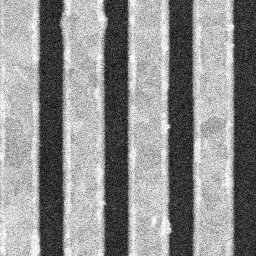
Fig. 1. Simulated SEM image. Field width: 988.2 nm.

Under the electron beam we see one or a few lines or trenches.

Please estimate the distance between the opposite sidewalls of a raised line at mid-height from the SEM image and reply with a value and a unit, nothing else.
0.139 microns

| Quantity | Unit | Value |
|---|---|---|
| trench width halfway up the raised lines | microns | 0.11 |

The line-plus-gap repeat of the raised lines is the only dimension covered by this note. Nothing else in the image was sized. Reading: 250 nanometres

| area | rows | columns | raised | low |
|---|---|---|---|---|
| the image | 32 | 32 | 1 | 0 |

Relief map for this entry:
11111000111110001111100011111000
11111000111110001111100011111000
11111000111110001111100011111000
11111000111110001111100011111000
11111000111110001111100011111000
11111000111110001111100011111000
11111000111110001111100011111000
11111000111110001111100011111000
11111000111110001111100011111000
11111000111110001111100011111000
11111000111110001111100011111000
11111000111110001111100001111000
11111000111110001111100001111000
11111000111110001111100001111000
11111000111110001111100001111000
11111000111110001111100001111000
11111000111110001111100001111000
11111000111110001111100001111000
11111000111110001111100011111000
11111000111110001111100011111000
11111000111110001111100011111000
11111000111110001111100001111000
11111000111110001111100001111000
11111000111110001111100001111000
11110000111110001111100001111000
11110000111110001111100001111000
11110000111110001111100001111000
11110000111110001111100001111000
11111000111110001111100001111000
11111000111110001111100001111000
11111000111110001111100001111000
11111000111110001111100001111000